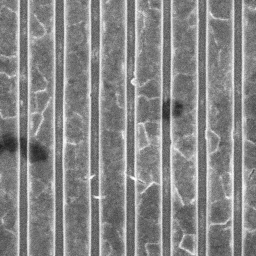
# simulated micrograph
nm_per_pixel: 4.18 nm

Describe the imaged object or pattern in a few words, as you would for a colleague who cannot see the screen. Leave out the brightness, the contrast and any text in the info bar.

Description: parallel lines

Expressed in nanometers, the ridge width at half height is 112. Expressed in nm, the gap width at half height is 37.6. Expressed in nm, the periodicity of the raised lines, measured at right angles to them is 148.